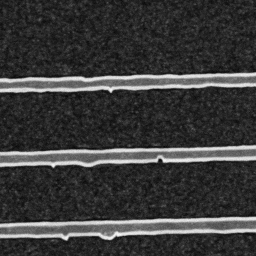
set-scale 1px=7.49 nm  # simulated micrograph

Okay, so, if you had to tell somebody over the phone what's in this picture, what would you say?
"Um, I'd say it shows one or a few lines or trenches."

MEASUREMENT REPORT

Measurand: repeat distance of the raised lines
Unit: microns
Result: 0.543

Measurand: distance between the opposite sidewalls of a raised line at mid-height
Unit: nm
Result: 93.6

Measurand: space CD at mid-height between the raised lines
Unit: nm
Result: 449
